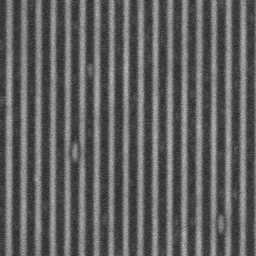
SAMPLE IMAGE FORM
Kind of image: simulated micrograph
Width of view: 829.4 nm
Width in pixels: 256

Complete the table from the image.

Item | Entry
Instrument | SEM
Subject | parallel lines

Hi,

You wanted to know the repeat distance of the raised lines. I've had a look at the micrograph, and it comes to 47.4 nm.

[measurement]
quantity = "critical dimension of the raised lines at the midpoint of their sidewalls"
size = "14.6 nm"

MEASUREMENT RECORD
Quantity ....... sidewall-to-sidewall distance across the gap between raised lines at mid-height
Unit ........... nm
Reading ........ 31.6